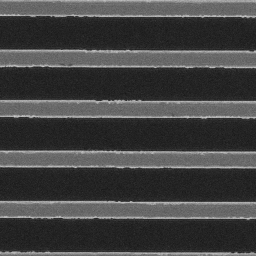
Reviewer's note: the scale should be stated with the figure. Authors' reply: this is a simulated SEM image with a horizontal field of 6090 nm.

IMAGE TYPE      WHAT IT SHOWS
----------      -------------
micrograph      lines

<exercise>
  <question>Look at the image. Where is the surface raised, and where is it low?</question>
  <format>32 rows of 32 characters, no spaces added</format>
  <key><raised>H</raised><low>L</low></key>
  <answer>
HHHHHHHHHHHHHHHHHHHHHHHHHHHHHHHH
HHHHHHHHHHHHHHHHHHHHHHHHHHHHHHHH
LLLLLLLLLLLLLLLLLLLLLLLLLLLLLLLL
LLLLLLLLLLLLLLLLLLLLLLLLLLLLLLLL
LLLLLLLLLLLLLLLLLLLLLLLLLLLLLLLL
LLLLLLLLLLLLLLLLLLLLLLLLLLLLLLLL
HHHHHHHHHHHHHHHHHHHHHHHHHHHHHHHL
HHHHHHHHHHHHHHHHHHHHHHHHHHHHHHHH
LLLLLLLLLLLLLLLLLLLLLLLLLLLLLLLL
LLLLLLLLLLLLLLLLLLLLLLLLLLLLLLLL
LLLLLLLLLLLLLLLLLLLLLLLLLLLLLLLL
LLLLLLLLLLLLLLLLLLLLLLLLLLLLLLLL
LLLLLLLLLLLLLLLLLLLLLLLLLLLLLLLL
HHHHHHHHHHHHHHHHHHHHHHHHHHHHHHHH
HHHHHHHHHHHHHHHHHHHHHHHHHHHHHHHH
LLLLLLLLLLLLLLLLLLLLLLLLLLLLLLLL
LLLLLLLLLLLLLLLLLLLLLLLLLLLLLLLL
LLLLLLLLLLLLLLLLLLLLLLLLLLLLLLLL
LLLLLLLLLLLLLLLLLLLLLLLLLLLLLLLL
HHHHHHHHHHHHHHHHHHHHHHHHHHHHHHHH
HHHHHHHHHHHHHHHHHHHHHHHHHHHHHHHH
LLLLLLLLLLLLLLLLLLLLLLLLLLLLLLLL
LLLLLLLLLLLLLLLLLLLLLLLLLLLLLLLL
LLLLLLLLLLLLLLLLLLLLLLLLLLLLLLLL
LLLLLLLLLLLLLLLLLLLLLLLLLLLLLLLL
HHHHHHHHHHHHHHHHHHHHHHHHHHHHHHHH
HHHHHHHHHHHHHHHHHHHHHHHHHHHHHHHH
LLLLLLLLLLLLLLLLLLLLLLLLLLLLLLLL
LLLLLLLLLLLLLLLLLLLLLLLLLLLLLLLL
LLLLLLLLLLLLLLLLLLLLLLLLLLLLLLLL
LLLLLLLLLLLLLLLLLLLLLLLLLLLLLLLL
LLLLLLLLLLLLLLLLLLLLLLLLLLLLLLLL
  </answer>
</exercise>